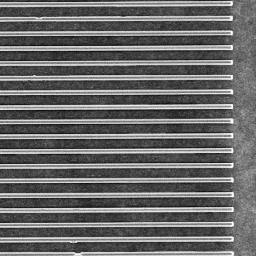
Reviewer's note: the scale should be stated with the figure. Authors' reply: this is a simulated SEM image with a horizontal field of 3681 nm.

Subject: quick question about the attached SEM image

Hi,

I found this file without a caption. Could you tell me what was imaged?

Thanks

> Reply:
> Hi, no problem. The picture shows parallel lines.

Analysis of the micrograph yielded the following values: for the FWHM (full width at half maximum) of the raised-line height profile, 50.3 nm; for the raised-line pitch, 14.7 px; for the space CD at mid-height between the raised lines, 10.6 pixels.